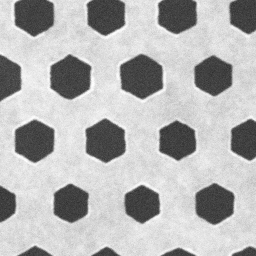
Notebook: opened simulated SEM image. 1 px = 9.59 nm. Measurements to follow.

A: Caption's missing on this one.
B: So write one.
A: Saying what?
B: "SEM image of a regular array of holes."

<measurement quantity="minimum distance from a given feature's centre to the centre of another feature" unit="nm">682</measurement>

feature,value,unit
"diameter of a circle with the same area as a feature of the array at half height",40.2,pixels